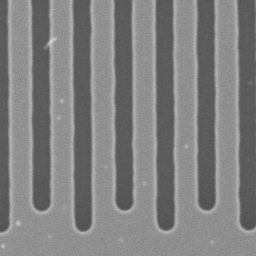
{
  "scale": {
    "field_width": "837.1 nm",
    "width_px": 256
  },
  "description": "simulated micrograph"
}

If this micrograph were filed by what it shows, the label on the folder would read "groups of lines, slits or small figures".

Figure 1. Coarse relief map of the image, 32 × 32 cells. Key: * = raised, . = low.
.***..***..***...**...***..***..
.***..***..***...**...***..***..
.***..***..***...**...***..***..
.***..***..***...**...***..***..
.***..***..***...**...***..***..
.***..***..***...**...***..***..
.***..***..***...**...***..***..
.***..***..***...**...***..***..
.***..***..***...**...***..***..
.***..***..***...**...***..***..
.***..***..***...**...***..***..
.***..***..***...**...***..***..
.***..***...**...**...***..***..
.***..***...**...**...***..***..
.***..***...**...**...***..***..
.***..***...**...**...***..***..
.***..***...**...**...***..***..
.***..***...**...***..***..***..
.***..***...**...***..***..***..
.***..***...**...***..***..***..
.***..***...**...**...***..***..
.***..***...**...***..***..***..
.***..***...**...***..***..***..
.***..***...**...***..***..***..
.***..***...**...***..***..***..
.***..***...**...**...***..***..
.********...********..********..
.********...********..********..
.*********.*********..********..
********************************
********************************
********************************